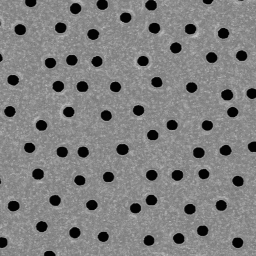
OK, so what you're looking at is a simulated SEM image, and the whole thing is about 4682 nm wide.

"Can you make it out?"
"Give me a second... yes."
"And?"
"a regular array of holes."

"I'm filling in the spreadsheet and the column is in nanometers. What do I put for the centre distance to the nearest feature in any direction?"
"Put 491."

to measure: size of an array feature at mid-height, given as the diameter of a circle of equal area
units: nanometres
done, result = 204